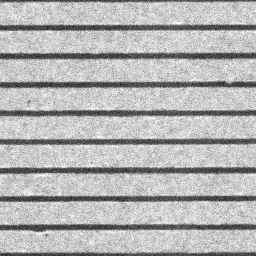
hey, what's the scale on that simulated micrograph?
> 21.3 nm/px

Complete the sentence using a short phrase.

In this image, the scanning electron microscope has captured parallel lines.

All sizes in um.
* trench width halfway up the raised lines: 0.143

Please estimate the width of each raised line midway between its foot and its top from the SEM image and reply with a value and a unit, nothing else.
22 px